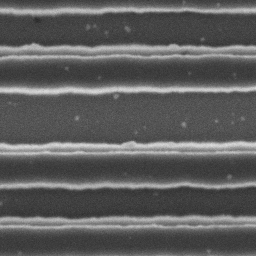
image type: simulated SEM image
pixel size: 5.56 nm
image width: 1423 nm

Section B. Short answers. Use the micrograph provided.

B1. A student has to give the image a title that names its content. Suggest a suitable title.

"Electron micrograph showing lines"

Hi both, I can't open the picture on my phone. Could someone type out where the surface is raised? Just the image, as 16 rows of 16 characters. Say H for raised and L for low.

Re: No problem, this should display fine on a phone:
HHHHHHHHHHHHHHHH
LLLLLLLLLLLLLLLL
LLLLLLLLLLLLLLLL
HHHHHHHHHHHHHHHH
HHHHHHHHHHHHHHHH
HHHHHHHHHHHHHHHH
LLLLLLLLLLLLLLLL
LLLLLLLLLLLLLLLL
LLLLLLLLLLLLLLLL
HHHHHHHHHHHHHHHH
HHHHHHHHHHHHHHHH
HHHHHHHHHHHHHHHH
LLLLLLLLLLLLLLLL
LLLLLLLLLLLLLLLL
HHHHHHHHHHHHHHHH
HHHHHHHHHHHHHHHH